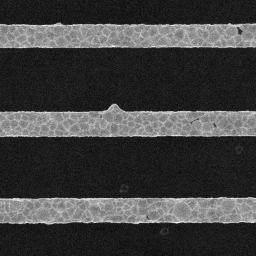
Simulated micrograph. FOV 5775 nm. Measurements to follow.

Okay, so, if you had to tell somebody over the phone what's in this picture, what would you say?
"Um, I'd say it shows one or a few lines or trenches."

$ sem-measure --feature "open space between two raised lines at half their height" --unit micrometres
1.42